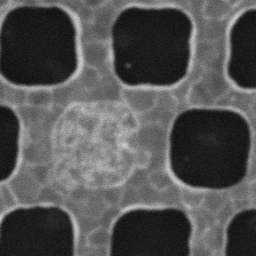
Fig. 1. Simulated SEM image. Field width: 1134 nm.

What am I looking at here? holes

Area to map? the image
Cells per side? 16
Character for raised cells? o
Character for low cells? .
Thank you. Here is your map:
o...oooo...ooooo
.....oo.....ooo.
.....oo.....oo..
.....oo.....oo..
.....oo.....oo..
ooooooooooooooo.
oooooooooooooooo
.oooooooooo....o
.oooooooooo.....
.oooooooooo.....
.oooooooooo....o
oooooooooooo...o
oooooooooooooooo
....oooo....ooo.
.....oo.....oo..
.....oo.....oo..